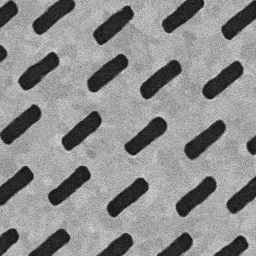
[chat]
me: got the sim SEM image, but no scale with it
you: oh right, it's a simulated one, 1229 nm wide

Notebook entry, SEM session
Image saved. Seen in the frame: a regular array of holes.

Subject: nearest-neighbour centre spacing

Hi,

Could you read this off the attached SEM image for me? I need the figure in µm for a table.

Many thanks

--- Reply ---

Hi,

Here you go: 0.273